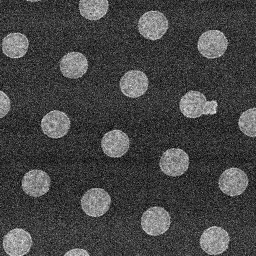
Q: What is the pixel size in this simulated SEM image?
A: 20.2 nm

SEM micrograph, a regular array of raised bodies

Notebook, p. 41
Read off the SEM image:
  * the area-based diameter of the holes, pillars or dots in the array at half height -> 27.4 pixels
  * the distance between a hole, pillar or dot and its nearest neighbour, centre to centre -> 1250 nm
